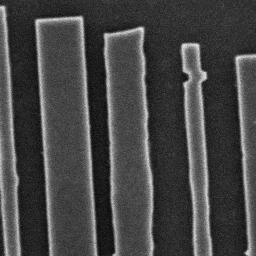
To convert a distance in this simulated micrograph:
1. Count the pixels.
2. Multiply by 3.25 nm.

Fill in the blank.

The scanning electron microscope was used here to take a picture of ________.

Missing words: one or a few lines or trenches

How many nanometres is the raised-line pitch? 210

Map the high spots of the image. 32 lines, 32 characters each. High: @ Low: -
--------------------------------
@-------------------------------
@----@@@@@----------------------
@----@@@@@----------------------
@----@@@@@---@@@@@--------------
@----@@@@@---@@@@@--------------
@----@@@@@---@@@@@-----@@-------
@----@@@@@@--@@@@@-----@@-----@@
@----@@@@@@--@@@@@-----@@-----@@
@----@@@@@@--@@@@@------@@----@@
@----@@@@@@---@@@@-----@@-----@@
@----@@@@@@--@@@@@-----@@-----@@
@----@@@@@@---@@@@-----@@-----@@
@----@@@@@@---@@@@-----@@-----@@
@----@@@@@@---@@@@-----@@-----@@
@@---@@@@@@---@@@@-----@@-----@@
@@---@@@@@@---@@@@-----@@-----@@
@@---@@@@@@---@@@@-----@@@----@@
@@----@@@@@---@@@@------@@----@@
@@----@@@@@---@@@@------@@----@@
@@----@@@@@---@@@@@-----@@-----@
@@----@@@@@---@@@@@-----@@-----@
@@----@@@@@---@@@@@-----@@-----@
@@----@@@@@@--@@@@@-----@@-----@
@@----@@@@@@--@@@@@-----@@-----@
@@----@@@@@@--@@@@@-----@@-----@
@@----@@@@@@--@@@@@-----@@-----@
@@----@@@@@@--@@@@@-----@@-----@
-@----@@@@@@--@@@@@-----@@-----@
-@----@@@@@@--@@@@@-----@@-----@
-@----@@@@@@--@@@@@-----@@-----@
-@----@@@@@@--@@@@@-----@@-----@